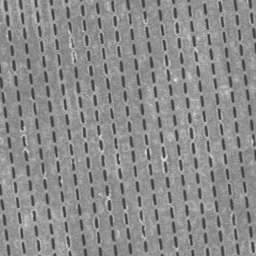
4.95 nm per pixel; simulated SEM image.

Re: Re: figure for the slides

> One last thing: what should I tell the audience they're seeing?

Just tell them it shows a regular array of holes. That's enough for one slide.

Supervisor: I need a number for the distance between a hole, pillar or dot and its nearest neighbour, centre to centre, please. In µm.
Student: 0.0735